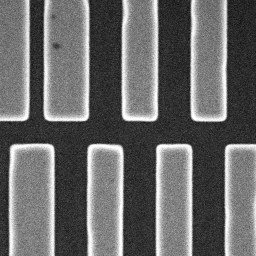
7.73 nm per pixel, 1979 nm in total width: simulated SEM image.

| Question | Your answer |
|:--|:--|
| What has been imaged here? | groups of lines, slits or small figures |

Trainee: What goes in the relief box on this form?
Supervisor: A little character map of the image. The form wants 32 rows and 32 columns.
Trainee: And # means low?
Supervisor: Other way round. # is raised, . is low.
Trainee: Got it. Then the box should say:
####..#####.....###.....####....
####..#####.....###.....####....
####..#####....#####....####....
####..#####....#####....####....
####..#####....#####....####....
####..#####....#####....####....
####..#####....#####....####....
####..#####....#####....####....
####..#####....#####....####....
####..#####....#####....####....
####..#####....#####....####....
####..#####....#####....####....
####..#####....#####....####....
####..#####....#####....####....
###...#####....#####....####....
................................
................................
................................
..####.....####.....####....####
.######....####.....####....####
.######....####.....####....####
.######....####.....####....####
.######....####.....####....####
.######....####.....####....####
.######....####.....####....####
.######....####.....####....####
.######....####.....####....####
.######....####.....####....####
.######....####.....####....####
.######....####.....####....####
.######....####.....####....####
.######....####.....####....####